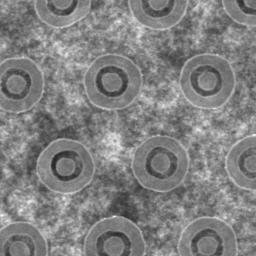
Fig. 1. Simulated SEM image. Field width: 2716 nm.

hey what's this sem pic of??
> ring-shaped raised bodies with a dot in the middle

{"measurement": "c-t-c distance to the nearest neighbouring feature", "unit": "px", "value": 94.7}